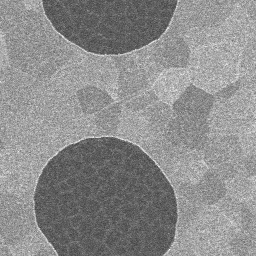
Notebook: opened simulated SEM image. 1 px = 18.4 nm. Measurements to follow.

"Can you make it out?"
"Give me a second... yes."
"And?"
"holes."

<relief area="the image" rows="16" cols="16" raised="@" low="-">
@@@--------@@@@@
@@@--------@@@@@
@@@@------@@@@@@
@@@@@@@@@@@@@@@@
@@@@@@@@@@@@@@@@
@@@@@@@@@@@@@@@@
@@@@@@@@@@@@@@@@
@@@@@@@@@@@@@@@@
@@@@@@@@@@@@@@@@
@@@@-----@@@@@@@
@@@-------@@@@@@
@@---------@@@@@
@@---------@@@@@
@@---------@@@@@
@@@--------@@@@@
@@@--------@@@@@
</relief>